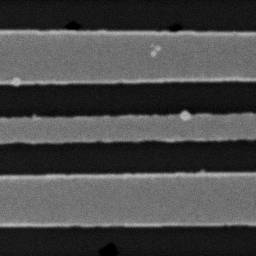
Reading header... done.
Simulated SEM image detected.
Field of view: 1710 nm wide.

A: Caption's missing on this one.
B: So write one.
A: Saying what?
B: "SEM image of lines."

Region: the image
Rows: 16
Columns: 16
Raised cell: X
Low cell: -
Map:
----------------
----------------
XXXXXXXXXXXXXXXX
XXXXXXXXXXXXXXXX
XXXXXXXXXXXXXXXX
----------------
----------------
XXXXXXXXXXXXXXXX
XXXXXXXXXXXXXXXX
----------------
----------------
XXXXXXXXXXXXXXXX
XXXXXXXXXXXXXXXX
XXXXXXXXXXXXXXXX
----------------
----------------